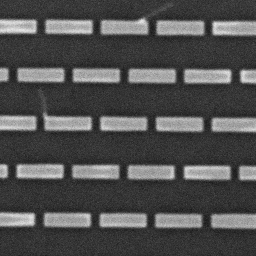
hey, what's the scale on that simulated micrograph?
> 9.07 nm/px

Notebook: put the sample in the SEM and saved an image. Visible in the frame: an array of small figures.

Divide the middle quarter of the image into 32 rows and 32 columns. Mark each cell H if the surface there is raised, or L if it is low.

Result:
LLLLLLLLLLLLLLLLLLLLLLLLLLLLLLLL
LLLHHLLHHHHHHHLLLHHHHHHHHHHHLLLL
LLHHHHHHHHHHHHLLHHHHHHHHHHHHLLHH
LLHHHHHHHHHHHHLLHHHHHHHHHHHHLLHH
LLLLLLLLLLLLLLLLLLLLLLLLLLHHLLHH
LLLLLLLLLLLLLLLLLLLLLLLLLLLLLLLL
LLLLLLLLLLLLLLLLLLLLLLLLLLLLLLLL
LLLLLLLLLLLLLLLLLLLLLLLLLLLLLLLL
LLLLLLLLLLLLLLLLLLLLLLLLLLLLLLLL
LLLLLLLLLLLLLLLLLLLLLLLLLLLLLLLL
LLLLLLLLLLLLLLLLLLLLLLLLLLLLLLLL
LLLLLLLLLLLLLLLLLLLLLLLLLLLLLLLL
LLLLLLLLLLLLLLLLLLLLLLLLLLLLLLLL
LHHHHHHLLHHHHHHLLLLLLLLLLLLLLLLL
HHHHHHHLLHHHHHHHHHHHLLLHHHHHHHHH
HHHHHHLLLLHHHHHHHHHHLLLHHHHHHHHH
LLLLLLLLLLLLLLHHHHLLLLLLLLHHHHHH
LLLLLLLLLLLLLLLLLLLLLLLLLLLLLLLL
LLLLLLLLLLLLLLLLLLLLLLLLLLLLLLLL
LLLLLLLLLLLLLLLLLLLLLLLLLLLLLLLL
LLLLLLLLLLLLLLLLLLLLLLLLLLLLLLLL
LLLLLLLLLLLLLLLLLLLLLLLLLLLLLLLL
LLLLLLLLLLLLLLLLLLLLLLLLLLLLLLLL
LLLLLLLLLLLLLLLLLLLLLLLLLLLLLLLL
LLLLLLLLLLLLLLLLLLLLLLLLLLLLLLLL
LLLLLLLLLLLLLLLLLLLLLLLLLLLLLLLL
LLHHHHHHHHHHHHLLHHHHHHHHHHHLLLHH
LLHHHHHHHHHHHHLLHHHHHHHHHHHLLLHH
LLLLLLLLLLLHHLLLHHHHHHHHHHLLLLLL
LLLLLLLLLLLLLLLLLLLLLLLLLLLLLLLL
LLLLLLLLLLLLLLLLLLLLLLLLLLLLLLLL
LLLLLLLLLLLLLLLLLLLLLLLLLLLLLLLL